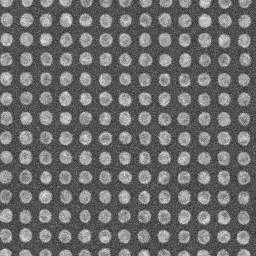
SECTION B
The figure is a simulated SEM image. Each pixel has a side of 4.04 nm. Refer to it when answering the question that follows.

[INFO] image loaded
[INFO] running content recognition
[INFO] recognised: a regular array of raised bodies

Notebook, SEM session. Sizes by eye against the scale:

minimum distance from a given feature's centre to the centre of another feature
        77.8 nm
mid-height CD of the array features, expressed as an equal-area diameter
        48.2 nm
